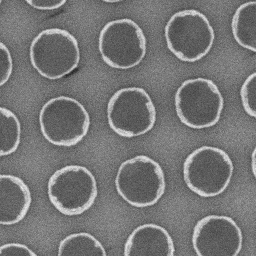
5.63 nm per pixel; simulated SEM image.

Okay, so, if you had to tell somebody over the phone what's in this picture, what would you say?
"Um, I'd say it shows a regular array of raised bodies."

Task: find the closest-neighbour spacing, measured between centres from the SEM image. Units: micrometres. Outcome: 0.384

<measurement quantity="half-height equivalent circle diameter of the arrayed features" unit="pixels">47.4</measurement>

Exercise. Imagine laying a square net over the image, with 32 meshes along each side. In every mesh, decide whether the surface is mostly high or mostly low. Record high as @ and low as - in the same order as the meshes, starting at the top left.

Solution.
----@@@@-----------------------@
-----------------------@------@@
---------------------@@@@@---@@@
-------------@@@@----@@@@@---@@@
-----@@@@----@@@@@---@@@@@@--@@@
----@@@@@----@@@@@---@@@@@----@@
@---@@@@@@---@@@@@----@@@@------
@---@@@@@@---@@@@@--------------
@----@@@@-----------------------
@-----@@------------------------
-----------------------@@@-----@
---------------@@@----@@@@@---@@
-------@@-----@@@@@---@@@@@@--@@
-----@@@@@----@@@@@---@@@@@@---@
@@---@@@@@@---@@@@@---@@@@@-----
@@---@@@@@@---@@@@@-----@@------
@@---@@@@@@----@@@--------------
@@----@@@@----------------------
@@------------------------------
------------------------@@@@----
---------------@@@@----@@@@@@---
-------@@@@----@@@@@---@@@@@@---
@@----@@@@@@---@@@@@---@@@@@@---
@@@---@@@@@@---@@@@@----@@@@----
@@@@--@@@@@@---@@@@@------------
@@@@---@@@@------@@-------------
@@@-----@@----------------------
@@-----------------------@@@@---
------------------@@-----@@@@@--
---------@@------@@@@---@@@@@@--
--------@@@@----@@@@@@--@@@@@@--
@@@@---@@@@@@---@@@@@----@@@@@--